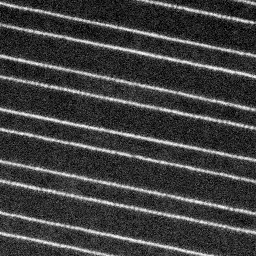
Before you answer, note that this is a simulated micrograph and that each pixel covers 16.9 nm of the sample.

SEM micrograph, lines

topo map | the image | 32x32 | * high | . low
*...................************
******...................*******
**********...................***
..*************.................
.......*************............
............*************.......
.................*************..
***..................***********
********...................*****
************...................*
....*************...............
.........*************..........
..............************......
...................************.
****....................********
*********....................***
..************..................
......*************.............
...........**************.......
................*************...
**...................***********
*******...................******
************...................*
....*************...............
.........************...........
..............*************.....
..................*************.
*****...................********
**********...................***
.*************..................
.......************.............
...........*************........